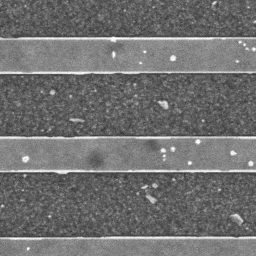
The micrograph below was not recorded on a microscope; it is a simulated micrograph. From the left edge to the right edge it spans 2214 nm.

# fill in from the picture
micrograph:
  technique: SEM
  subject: lines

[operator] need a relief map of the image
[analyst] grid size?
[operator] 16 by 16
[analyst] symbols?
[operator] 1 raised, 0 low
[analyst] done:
0000000000000000
0000000000000000
1111111111111111
1111111111111111
1111111111111111
0000000000000000
0000000000000000
0000000000000000
0000000000000000
1111111111111111
1111111111111111
0000000000000000
0000000000000000
0000000000000000
0000000000000000
1111111111111111